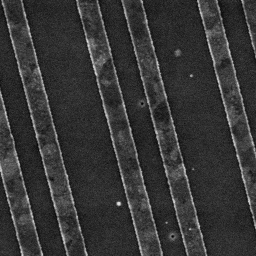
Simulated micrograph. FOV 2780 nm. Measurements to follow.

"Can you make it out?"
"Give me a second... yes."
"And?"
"lines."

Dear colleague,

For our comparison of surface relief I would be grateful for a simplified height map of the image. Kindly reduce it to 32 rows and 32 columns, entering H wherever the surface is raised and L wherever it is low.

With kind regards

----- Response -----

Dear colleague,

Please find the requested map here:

HHHLLLLLLLHHLLLHHHLLLLLLLHHLLLHH
LHHLLLLLLLHHHLLLHHLLLLLLLHHLLLLH
LHHLLLLLLLHHHLLLHHLLLLLLLHHHLLLH
LHHHLLLLLLHHHLLLHHHLLLLLLLHHLLLH
LHHHLLLLLLLHHLLLHHHLLLLLLLHHLLLH
LLHHLLLLLLLHHHLLLHHLLLLLLLHHHLLL
LLHHLLLLLLLHHHLLLHHLLLLLLLHHHLLL
LLHHHLLLLLLHHHLLLHHHLLLLLLLHHLLL
LLHHHLLLLLLLHHLLLHHHLLLLLLLHHLLL
LLLHHLLLLLLLHHHLLLHHLLLLLLLHHHLL
LLLHHLLLLLLLHHHLLLHHLLLLLLLHHHLL
LLLHHHLLLLLLHHHLLLHHHLLLLLLLHHLL
LLLHHHLLLLLLLHHLLLHHHLLLLLLLHHLL
HLLLHHLLLLLLLHHHLLLHHLLLLLLLHHHL
HLLLHHLLLLLLLHHHLLLHHLLLLLLLHHHL
HLLLHHHLLLLLLLHHLLLHHHLLLLLLLHHL
HLLLHHHLLLLLLLHHLLLHHHLLLLLLLHHL
HHLLLHHLLLLLLLHHHLLLHHLLLLLLLHHH
HHLLLHHLLLLLLLHHHLLLHHLLLLLLLHHH
HHLLLHHHLLLLLLLHHLLLHHHLLLLLLLHH
HHLLLHHHLLLLLLLHHLLLHHHLLLLLLLHH
HHHLLLHHLLLLLLLHHHLLLHHLLLLLLLHH
HHHLLLHHHLLLLLLHHHLLLHHLLLLLLLHH
LHHLLLHHHLLLLLLLHHLLLHHHLLLLLLLH
LHHLLLHHHLLLLLLLHHLLLHHHLLLLLLLH
LHHHLLLHHLLLLLLLHHHLLLHHLLLLLLLH
LHHHLLLHHHLLLLLLHHHLLLHHLLLLLLLH
LLHHLLLHHHLLLLLLLHHLLLHHHLLLLLLL
LLHHLLLLHHLLLLLLLHHLLLHHHLLLLLLL
LLHHHLLLHHLLLLLLLHHHLLLHHLLLLLLL
LLHHHLLLHHHLLLLLLHHHLLLHHLLLLLLL
LLLHHLLLHHHLLLLLLLHHLLLHHHLLLLLL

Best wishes